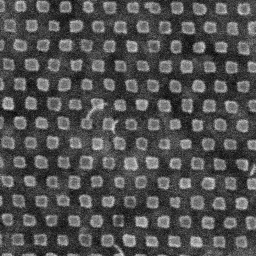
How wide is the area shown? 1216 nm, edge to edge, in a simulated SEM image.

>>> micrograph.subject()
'a regular array of raised bodies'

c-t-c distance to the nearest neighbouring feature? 103 nm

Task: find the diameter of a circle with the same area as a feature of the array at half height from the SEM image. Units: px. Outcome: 11.6